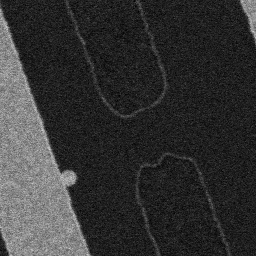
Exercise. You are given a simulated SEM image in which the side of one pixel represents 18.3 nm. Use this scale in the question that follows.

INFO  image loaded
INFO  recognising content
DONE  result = one or a few lines or trenches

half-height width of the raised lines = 1.2 microns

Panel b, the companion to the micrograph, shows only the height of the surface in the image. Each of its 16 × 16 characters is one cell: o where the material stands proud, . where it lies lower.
....ooooo......o
.....oooo.......
o....oooo.......
o....ooooo......
o.....oooo......
oo....oooo......
oo.....ooo......
oo..............
ooo.............
ooo.............
oooo.....ooo....
oooo.....oooo...
oooo.....oooo...
ooooo....oooo...
ooooo....ooooo..
.oooo.....oooo..